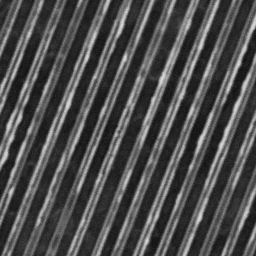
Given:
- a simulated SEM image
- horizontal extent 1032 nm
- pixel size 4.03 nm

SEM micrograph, parallel lines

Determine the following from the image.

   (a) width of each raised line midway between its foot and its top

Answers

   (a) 31.9 nm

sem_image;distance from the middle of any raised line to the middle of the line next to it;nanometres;82.4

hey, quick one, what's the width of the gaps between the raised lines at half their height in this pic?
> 12.8 pixels